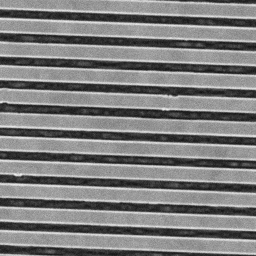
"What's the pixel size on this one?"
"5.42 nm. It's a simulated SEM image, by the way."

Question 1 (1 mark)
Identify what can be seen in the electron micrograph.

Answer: parallel lines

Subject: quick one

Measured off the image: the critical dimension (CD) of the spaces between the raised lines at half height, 51.5 nm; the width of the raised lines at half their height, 72.5 nm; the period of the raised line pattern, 128 nm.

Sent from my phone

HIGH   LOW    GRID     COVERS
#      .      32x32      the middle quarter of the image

................................
########........................
################################
################################
...#############################
.............................###
................................
##############..................
################################
################################
.....###########################
.........................##...##
................................
###############.................
################################
################################
......##########################
................................
................................
################................
################################
################################
.............###################
................................
................................
#################...............
################################
################################
..............##################
................................
................................
#########################.......